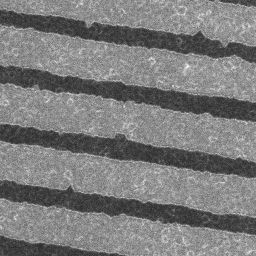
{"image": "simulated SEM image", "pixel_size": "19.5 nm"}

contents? parallel lines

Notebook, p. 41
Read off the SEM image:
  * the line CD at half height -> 0.348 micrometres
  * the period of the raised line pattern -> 1100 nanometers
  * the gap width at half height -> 0.715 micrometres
